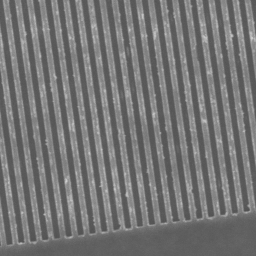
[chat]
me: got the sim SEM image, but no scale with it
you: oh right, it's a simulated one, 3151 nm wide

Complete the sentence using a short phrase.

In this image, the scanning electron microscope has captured parallel lines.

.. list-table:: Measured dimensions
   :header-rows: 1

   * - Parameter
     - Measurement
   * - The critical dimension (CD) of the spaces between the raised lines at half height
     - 82.3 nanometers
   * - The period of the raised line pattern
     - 148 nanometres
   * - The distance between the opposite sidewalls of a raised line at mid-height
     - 70.1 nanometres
